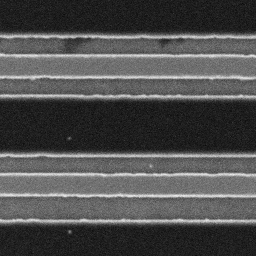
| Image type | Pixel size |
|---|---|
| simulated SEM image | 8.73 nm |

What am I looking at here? lines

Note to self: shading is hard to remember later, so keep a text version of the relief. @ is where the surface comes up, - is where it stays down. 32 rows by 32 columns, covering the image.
@@@@@@@@@@@@@@@@@@@@@@@@@@@@@@@@
@@@@@@@@@@@@@@@@@@@@@@@@@@@@@@@@
@@@@@@@@@@@@@@@@@@@@@@@@@@@@@@@@
@@@@@@@@@@@@@@@@@@@@@@@@@@@@@@@@
@@@@@@@@@@@@@@@@@@@@@@@@@@@@@@@@
--------------------------------
--------------------------------
@@@@@@@@@@@@@@@@@@@@@@@@@@@@@@@@
@@@@@@@@@@@@@@@@@@@@@@@@@@@@@@@@
@@@@@@@@@@@@@@@@@@@@@@@@@@@@@@@@
--------------------------------
--------------------------------
@@@@@@@@@@@@@@@@@@@@@@@@@@@@@@@@
@@@@@@@@@@@@@@@@@@@@@@@@@@@@@@@@
@@@@@@@@@@@@@@@@@@@@@@@@@@@@@@@@
@@@@@@@@@@@@@@@@@@@@@@@@@@@@@@@@
@@@@@@@@@@@@@@@@@@@@@@@@@@@@@@@@
@@@@@@@@@@@@@@@@@@@@@@@@@@@@@@@@
@@@@@@@@@@@@@@@@@@@@@@@@@@@@@@@@
@@@@@@@@@@@@@@@@@@@@@@@@@@@@@@@@
--------------------------------
--------------------------------
@@@@@@@@@@@@@@@@@@@@@@@@@@@@@@@@
@@@@@@@@@@@@@@@@@@@@@@@@@@@@@@@@
---------@@--@---@@@@@--@@@-@@@@
--------------------------------
--------------------------------
-@@@@-----@----@-----@@--@------
@@@@@@@@@@@@@@@@@@@@@@@@@@@@@@@@
@@@@@@@@@@@@@@@@@@@@@@@@@@@@@@@@
@@@@@@@@@@@@@@@@@@@@@@@@@@@@@@@@
@@@@@@@@@@@@@@@@@@@@@@@@@@@@@@@@